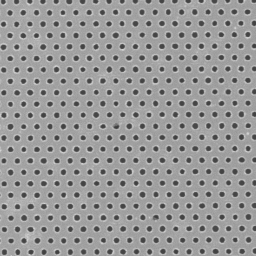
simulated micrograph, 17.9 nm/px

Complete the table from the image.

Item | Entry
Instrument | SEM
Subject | a regular array of holes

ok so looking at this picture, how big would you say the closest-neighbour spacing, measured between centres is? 231 nanometers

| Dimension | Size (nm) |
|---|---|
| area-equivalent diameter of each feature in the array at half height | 97.2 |